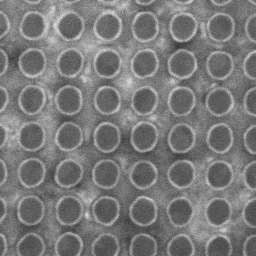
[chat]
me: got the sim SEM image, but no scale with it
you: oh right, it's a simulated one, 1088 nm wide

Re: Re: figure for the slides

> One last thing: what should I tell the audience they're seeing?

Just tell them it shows a regular array of raised bodies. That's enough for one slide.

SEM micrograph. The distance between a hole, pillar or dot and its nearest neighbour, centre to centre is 156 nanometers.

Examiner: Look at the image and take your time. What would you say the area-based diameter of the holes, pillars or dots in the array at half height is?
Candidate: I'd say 0.118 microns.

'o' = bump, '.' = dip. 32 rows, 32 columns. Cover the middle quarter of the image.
ooooo...oooooo...oooooo...oooooo
oooo....oooooo...oooooo...oooooo
ooo.....ooooo.....oooo.....ooooo
.............................o..
................................
................................
oooo.....oooo.....ooooo.....oooo
oooo....oooooo....ooooo....ooooo
oooo....oooooo...oooooo...oooooo
oooo....oooooo...oooooo...oooooo
oooo....oooooo...oooooo...oooooo
oooo.....oooo.....oooo.....ooooo
ooo.......o........oo......oooo.
................................
................................
oooo.....oooo.....oooo......ooo.
oooo....oooooo...oooooo....ooooo
oooo....oooooo...oooooo...oooooo
ooooo...oooooo...oooooo...oooooo
oooo....oooooo...oooooo...oooooo
oooo....ooooo....ooooo....oooooo
.o.......ooo.......oo......oooo.
................................
................................
ooo......ooo.......oo.......ooo.
oooo....ooooo.....oooo.....ooooo
ooooo..ooooooo...oooooo...oooooo
ooooo..ooooooo...oooooo...oooooo
oooo...ooooooo...oooooo...oooooo
oooo....ooooo....oooooo....ooooo
oo.......oooo.....ooo.......ooo.
................................